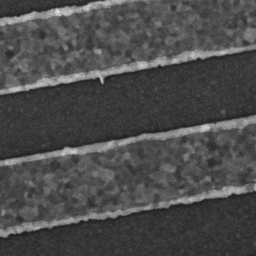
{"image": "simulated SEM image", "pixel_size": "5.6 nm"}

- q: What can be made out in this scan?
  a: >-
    one or a few lines or trenches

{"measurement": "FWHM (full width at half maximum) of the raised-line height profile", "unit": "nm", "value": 392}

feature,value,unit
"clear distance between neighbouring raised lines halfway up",392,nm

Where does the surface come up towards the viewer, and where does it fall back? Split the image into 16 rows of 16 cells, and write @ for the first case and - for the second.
-----@@@@@@@@@@@
@@@@@@@@@@@@@@@@
@@@@@@@@@@@@@@@@
@@@@@@@@@@@@@---
@@@@@@@---------
@---------------
----------------
---------------@
---------@@@@@@@
----@@@@@@@@@@@@
@@@@@@@@@@@@@@@@
@@@@@@@@@@@@@@@@
@@@@@@@@@@@@----
@@@@@@----------
@---------------
----------------